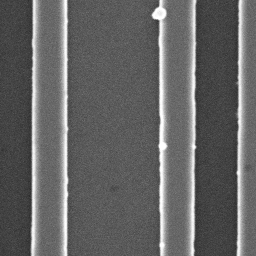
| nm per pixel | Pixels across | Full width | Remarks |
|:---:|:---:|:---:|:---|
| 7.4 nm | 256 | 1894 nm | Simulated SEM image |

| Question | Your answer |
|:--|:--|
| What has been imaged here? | lines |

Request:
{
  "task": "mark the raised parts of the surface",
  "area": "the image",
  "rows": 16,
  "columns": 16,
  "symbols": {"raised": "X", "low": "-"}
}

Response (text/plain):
--XX------XX---X
--XX------XX---X
--XX------XX---X
--XX------XX---X
--XX------XX---X
--XX------XX---X
--XX------XX---X
--XX------XX---X
--XX------XX---X
--XX------XX---X
--XX------XX---X
--XX------XX---X
--XX------XX---X
--XX------XX---X
--XX------XX---X
--XX------XX---X